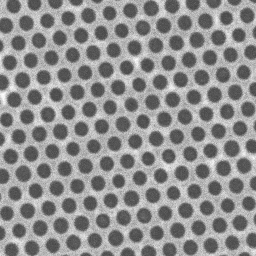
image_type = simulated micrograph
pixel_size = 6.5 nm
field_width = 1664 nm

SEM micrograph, a regular array of holes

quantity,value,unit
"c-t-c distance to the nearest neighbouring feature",135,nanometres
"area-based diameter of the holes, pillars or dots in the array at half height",101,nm